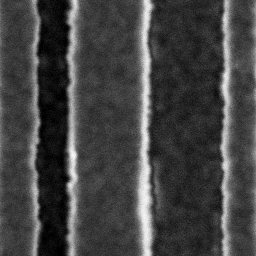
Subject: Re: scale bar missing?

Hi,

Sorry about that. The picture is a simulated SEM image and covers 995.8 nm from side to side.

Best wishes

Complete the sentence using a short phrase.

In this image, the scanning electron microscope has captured lines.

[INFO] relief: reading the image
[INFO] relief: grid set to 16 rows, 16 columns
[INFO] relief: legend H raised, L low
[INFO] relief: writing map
HHLLLHHHHLLLLLHH
HHLLHHHHHLLLLLHH
HHLLHHHHHLLLLLHH
HHLLHHHHHLLLLLHH
HHLLHHHHHLLLLLHH
HHLLHHHHHLLLLLHH
HHLLHHHHHLLLLLHH
HHLLHHHHHLLLLLHH
HHLLHHHHHLLLLLHH
HHLLHHHHHLLLLLHH
HHLLHHHHHLLLLLHH
HHLLHHHHHLLLLLHH
HHLLHHHHHLLLLLHH
HHLLHHHHHLLLLLHH
HHLLHHHHHLLLLLHH
HHLLHHHHHLLLLLHH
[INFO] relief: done